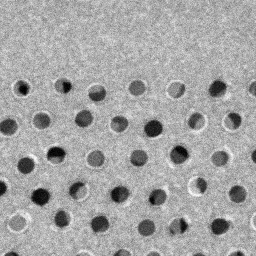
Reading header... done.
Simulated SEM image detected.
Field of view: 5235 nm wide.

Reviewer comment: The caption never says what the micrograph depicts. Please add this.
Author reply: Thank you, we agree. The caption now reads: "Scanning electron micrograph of a regular array of raised bodies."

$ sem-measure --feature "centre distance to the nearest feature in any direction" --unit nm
716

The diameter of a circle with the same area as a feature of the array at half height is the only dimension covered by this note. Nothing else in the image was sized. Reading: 400 nanometres